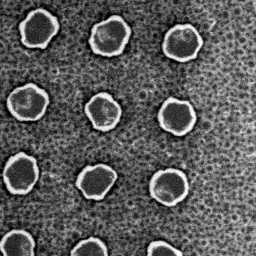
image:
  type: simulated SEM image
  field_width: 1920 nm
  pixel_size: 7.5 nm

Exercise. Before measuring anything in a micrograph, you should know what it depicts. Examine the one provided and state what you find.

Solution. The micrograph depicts a regular array of raised bodies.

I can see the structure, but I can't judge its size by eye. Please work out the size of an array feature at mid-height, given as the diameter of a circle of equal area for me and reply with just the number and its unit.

265 nanometres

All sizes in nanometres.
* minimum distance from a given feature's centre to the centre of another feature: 536